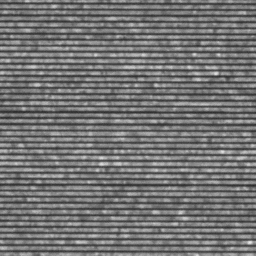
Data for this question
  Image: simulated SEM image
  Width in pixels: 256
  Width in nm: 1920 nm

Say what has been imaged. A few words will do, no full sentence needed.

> parallel lines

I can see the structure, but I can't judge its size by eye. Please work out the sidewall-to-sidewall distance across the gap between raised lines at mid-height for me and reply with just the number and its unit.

22.5 nm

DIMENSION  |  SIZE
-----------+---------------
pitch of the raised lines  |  0.0453 micrometres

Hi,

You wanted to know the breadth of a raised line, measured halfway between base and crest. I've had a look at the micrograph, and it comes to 22.5 nanometers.